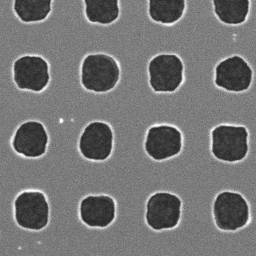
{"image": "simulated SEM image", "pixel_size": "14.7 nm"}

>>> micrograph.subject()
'a regular array of holes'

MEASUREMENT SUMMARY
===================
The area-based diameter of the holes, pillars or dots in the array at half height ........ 538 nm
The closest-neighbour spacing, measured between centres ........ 972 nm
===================